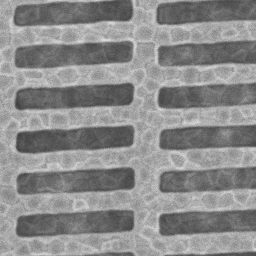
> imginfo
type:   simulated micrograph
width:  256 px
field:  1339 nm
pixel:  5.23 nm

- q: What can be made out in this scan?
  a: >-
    holes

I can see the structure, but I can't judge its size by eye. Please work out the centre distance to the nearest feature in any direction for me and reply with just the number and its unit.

42.1 pixels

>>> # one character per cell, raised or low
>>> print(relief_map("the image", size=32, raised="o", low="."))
oooo.............ooo............
oo...............ooo............
oo..............oooo............
oooooooooooooooooooooooooooooooo
oooooooooooooooooooooooooooooooo
oooooo..o.......ooooooo.........
oo...............ooo............
oo..............oooo............
ooo...oooooooooooooooooooooooooo
oooooooooooooooooooooooooooooooo
oooooooooooo..o.ooooooooooo.oo..
oo...............ooo............
oo...............ooo............
oo........ooooooooooo....ooooooo
oooooooooooooooooooooooooooooooo
oooooooooooooooooooooooooooooooo
ooo..............ooo............
oo...............ooo............
oo............oooooo.......ooooo
oooooooooooooooooooooooooooooooo
oooooooooooooooooooooooooooooooo
ooooo............oooo...........
oo...............ooo............
oo...............ooo............
oooooooooooooooooooooooooooooooo
oooooooooooooooooooooooooooooooo
oooooooooo.......ooooo..........
oo...............ooo............
oo...............ooo............
oo....oooooooooooooooooooooooooo
oooooooooooooooooooooooooooooooo
ooooooooooooooo.ooooooooooooo...